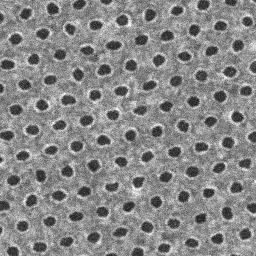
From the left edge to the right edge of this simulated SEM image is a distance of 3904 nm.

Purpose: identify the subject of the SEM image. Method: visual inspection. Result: a regular array of holes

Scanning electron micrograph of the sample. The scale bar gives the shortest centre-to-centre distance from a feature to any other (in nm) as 399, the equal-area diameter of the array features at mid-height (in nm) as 194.